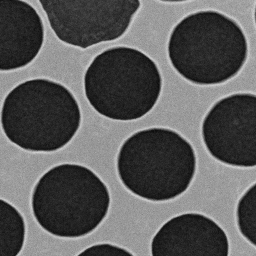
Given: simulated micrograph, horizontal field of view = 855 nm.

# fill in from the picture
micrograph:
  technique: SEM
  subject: holes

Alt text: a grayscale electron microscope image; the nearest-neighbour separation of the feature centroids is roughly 294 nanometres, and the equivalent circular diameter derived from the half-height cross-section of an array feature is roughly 249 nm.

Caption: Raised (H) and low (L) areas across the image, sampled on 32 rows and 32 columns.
LLLHHLLLLLLLLLLLLHHHHHHHHHHHHHHH
LLLLLHLLLLLLLLLLLHHHHHHHHLLHHHHH
LLLLLHLLLLLLLLLLHHHHHHHLLLLLLHHH
LLLLLHLLLLLLLLLLHHHHHHLLLLLLLLHH
LLLLLHHLLLLLLLLHHHHHHLLLLLLLLLLH
LLLLLHHHHLLLHHHHHHHHHLLLLLLLLLLH
LLLLLHHHHHHHHLLLLLHHHLLLLLLLLLLH
LLLLHHHHHHHHLLLLLLLHHLLLLLLLLLLH
LLHHHHHHHHHLLLLLLLLLHHLLLLLLLLHH
HHHHHHHHHHHLLLLLLLLLHHHLLLLLLHHH
HHHLLLLHHHHLLLLLLLLLHHHHHHHHHHHH
HLLLLLLLLHHLLLLLLLLLHHHHHHHHHHHH
HLLLLLLLLHHLLLLLLLLLHHHHHHHHLLLL
LLLLLLLLLLHHLLLLLLLHHHHHHHHLLLLL
LLLLLLLLLLHHHLLLLLHHHHHHHHLLLLLL
LLLLLLLLLLHHHHHHHHHHHHHHHLLLLLLL
HLLLLLLLLHHHHHHHHLLLLLHHHLLLLLLL
HLLLLLLLLHHHHHHHLLLLLLLHHHLLLLLL
HHHLLLLHHHHHHHHLLLLLLLLLHHLLLLLL
HHHHHHHHHHHHHHHLLLLLLLLLHHHLLLLL
HHHHHHHHHHHHHHHLLLLLLLLLHHHHHLLL
HHHHHHLLLLLLHHHLLLLLLLLLHHHHHHHH
HHHHHLLLLLLLLHHLLLLLLLLLHHHHHHHH
HHHHLLLLLLLLLHHHLLLLLLLHHHHHHHHL
HHHHLLLLLLLLLLHHHHLLLLHHHHHHHHLL
LHHHLLLLLLLLLLHHHHHHHHHHHHHHHHLL
LLHHLLLLLLLLLHHHHHHHHHHHHHHHHHLL
LLLHHLLLLLLLLHHHHHHHHLLLLLHHHHLL
LLLHHLLLLLLLHHHHHHHHLLLLLLLLHHLL
LLLHHHHLLLHHHHHHHHHLLLLLLLLLHHHL
LLLHHHHHHHHHHHHHHHHLLLLLLLLLHHHH
LLHHHHHHHHLLLLLLHHHLLLLLLLLLHHHH